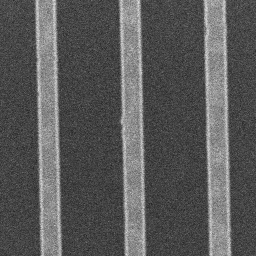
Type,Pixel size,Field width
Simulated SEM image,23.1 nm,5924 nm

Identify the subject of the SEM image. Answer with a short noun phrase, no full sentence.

one or a few lines or trenches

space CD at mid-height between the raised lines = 1550 nm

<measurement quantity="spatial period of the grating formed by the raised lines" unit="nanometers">1960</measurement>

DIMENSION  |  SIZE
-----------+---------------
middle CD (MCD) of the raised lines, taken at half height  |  399 nanometers